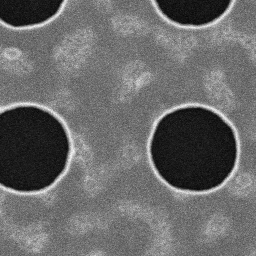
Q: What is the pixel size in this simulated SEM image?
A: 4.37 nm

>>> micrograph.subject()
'holes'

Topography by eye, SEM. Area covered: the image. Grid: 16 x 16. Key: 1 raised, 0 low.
0000111111000011
0011111111100111
1111111111111111
1111111111111111
1111111111111111
1111111111111111
1111111111111111
0000111111000011
0000111111000001
0000111110000001
0000111111000001
0001111111100011
1111111111111111
1111111111111111
1111111111111111
1111111111111111